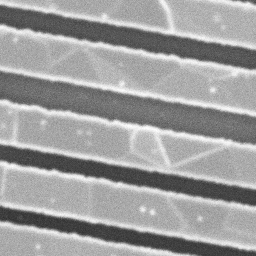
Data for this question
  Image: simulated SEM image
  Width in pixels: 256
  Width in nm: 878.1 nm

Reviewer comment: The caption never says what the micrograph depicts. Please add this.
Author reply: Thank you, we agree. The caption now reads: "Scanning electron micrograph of lines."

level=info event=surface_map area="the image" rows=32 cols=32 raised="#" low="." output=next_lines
###############################.
.....###########################
...........#####################
#................###############
#######................#########
#############................###
##################..............
########################........
#############################...
....############################
.........#######################
...............#################
.....................###########
#####......................#####
###########.....................
################................
######################..........
############################....
....############################
.........#######################
#.............##################
#######.............############
#############.............######
###################.............
#######################.........
##############################..
.....###########################
..........######################
#####...........################
##########............##########
###############............#####
#####################...........